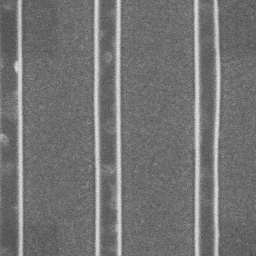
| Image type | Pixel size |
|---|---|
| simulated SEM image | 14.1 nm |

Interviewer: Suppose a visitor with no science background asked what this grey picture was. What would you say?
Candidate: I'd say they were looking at one or a few lines or trenches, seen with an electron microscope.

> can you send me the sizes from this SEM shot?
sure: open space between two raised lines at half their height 1070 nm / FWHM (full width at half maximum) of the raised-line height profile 22.5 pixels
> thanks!